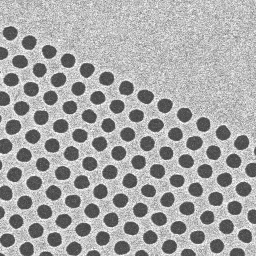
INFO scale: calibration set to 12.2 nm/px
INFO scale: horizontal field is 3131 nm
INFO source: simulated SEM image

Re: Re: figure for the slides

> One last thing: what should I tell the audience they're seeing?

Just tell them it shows a regular array of holes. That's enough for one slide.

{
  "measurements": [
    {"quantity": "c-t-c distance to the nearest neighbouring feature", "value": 252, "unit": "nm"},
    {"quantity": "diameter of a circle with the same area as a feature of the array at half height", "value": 183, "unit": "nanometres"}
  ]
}